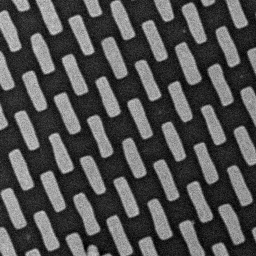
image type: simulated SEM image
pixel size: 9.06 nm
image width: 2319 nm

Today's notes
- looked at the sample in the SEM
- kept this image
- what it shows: groups of lines, slits or small figures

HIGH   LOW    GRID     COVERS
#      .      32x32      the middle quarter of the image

###.........###...###........###
.###........####..###.........##
.###.........###...###........##
..###....#.........###.........#
..###...###.........###........#
..###....##.........###...###...
...###...###.........###..###...
...##....###.........###...###..
#........####........##....###..
#.........###...###.........###.
##........####..###.........###.
##.........###..####........###.
###........##....###.........###
###...###.........##.........###
####..###.........###...........
.###...##..........##....##.....
.###...###.........###...###....
.......###.........###...###....
........###...............###...
........###....##.........###...
.........###...###........###...
.........###...###.........###..
#........###...####........###..
#....##.........###.........##..
##..###.........###....##.......
##...###.........###...###......
##...###.........###...###......
......###........###...###......
......###...............###.....
......####...###........###.....
.......###...###.........###...#
........##...###.........###...#